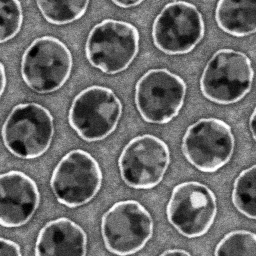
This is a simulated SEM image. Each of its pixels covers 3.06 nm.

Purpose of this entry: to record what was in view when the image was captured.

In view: a regular array of raised bodies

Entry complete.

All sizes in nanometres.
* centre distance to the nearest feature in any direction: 208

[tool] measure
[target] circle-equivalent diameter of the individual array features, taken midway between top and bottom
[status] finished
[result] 50.6 pixels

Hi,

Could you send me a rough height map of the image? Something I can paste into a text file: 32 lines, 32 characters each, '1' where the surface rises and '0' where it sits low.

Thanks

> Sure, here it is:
11000111111000011000011000011111
11100111110000000000111110011111
11100011100000000000111110011111
11000000000011111001111110001111
10000000000111111001111110000000
00001111000111111000111100000000
00011111100111111000011000011100
00011111100111110000000000111110
00011111100011110000000000111110
00011111000000000011110001111110
00011111000000000111111001111110
00000100001111000111111001111110
00000000011111100111111000011100
00111000011111100111110000000000
01111100011111100011110000000000
01111110011111100000000011110001
11111110001111000000000111111000
01111100000000000111000111111000
01111100000000001111100111111000
00110000111000011111100111111000
00000001111100011111100011110000
00000001111100011111000000000011
11110001111110001111000000000011
11110001111100000000001111000111
11111001111100000000001111100111
11111000110000011000011111100111
11110000000000111100011111100011
11100001000001111110011111000000
00000011110001111110001111000000
00000111111001111110000000001111
11000111111001111100000000011111
11000111111000110000011000011111